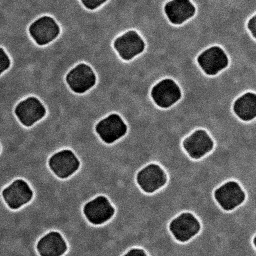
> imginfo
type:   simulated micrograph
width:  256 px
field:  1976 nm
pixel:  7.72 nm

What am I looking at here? a regular array of holes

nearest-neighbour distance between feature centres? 445 nm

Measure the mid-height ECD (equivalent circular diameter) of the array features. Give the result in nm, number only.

225